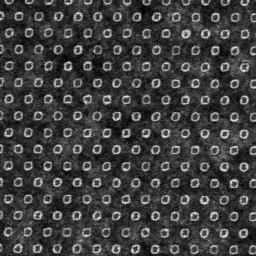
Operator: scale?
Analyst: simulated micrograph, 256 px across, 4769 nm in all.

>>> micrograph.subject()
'a regular array of raised bodies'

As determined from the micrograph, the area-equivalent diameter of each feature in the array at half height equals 156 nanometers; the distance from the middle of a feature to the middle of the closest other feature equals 354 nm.